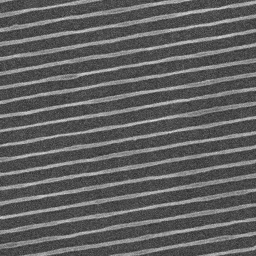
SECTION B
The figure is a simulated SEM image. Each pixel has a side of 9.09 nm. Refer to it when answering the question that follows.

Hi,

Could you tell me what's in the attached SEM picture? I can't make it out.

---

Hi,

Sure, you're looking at parallel lines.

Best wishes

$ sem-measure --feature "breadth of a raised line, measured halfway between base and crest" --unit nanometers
30.3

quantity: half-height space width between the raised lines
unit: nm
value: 98.7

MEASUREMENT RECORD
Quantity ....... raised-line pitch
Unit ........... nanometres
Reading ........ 130